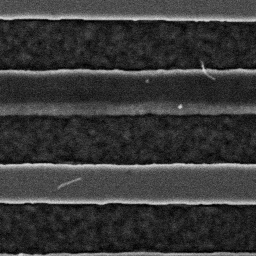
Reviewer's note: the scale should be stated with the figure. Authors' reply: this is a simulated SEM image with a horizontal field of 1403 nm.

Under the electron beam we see lines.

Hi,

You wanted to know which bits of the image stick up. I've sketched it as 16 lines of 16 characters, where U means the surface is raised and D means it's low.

UUUUUUUUUUUUUUUU
DDDDDDDDDDDDDDDD
DDDDDDDDDDDDDDDD
DDDDDDDDDDDDDDDD
UUUUUUUUUUUUUUUU
UUUUUUUUUUUUUUUU
UUUUUUUUUUUUUUUU
DDDDDDDDDDDDDDDD
DDDDDDDDDDDDDDDD
DDDDDDDDDDDDDDDD
UUUUUUUUUUUUUUUU
UUUUUUUUUUUUUUUU
UUUUUUUUUUUUUUUU
DDDDDDDDDDDDDDDD
DDDDDDDDDDDDDDDD
DDDDDDDDDDDDDDDD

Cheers